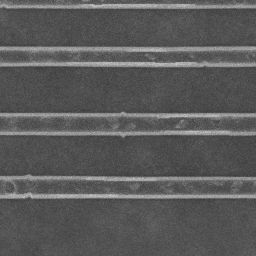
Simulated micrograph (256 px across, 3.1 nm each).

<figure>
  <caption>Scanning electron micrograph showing one or a few lines or trenches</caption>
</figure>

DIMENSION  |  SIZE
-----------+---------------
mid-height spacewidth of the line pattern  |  138 nm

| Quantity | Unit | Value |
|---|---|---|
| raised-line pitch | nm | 202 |